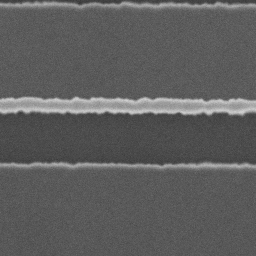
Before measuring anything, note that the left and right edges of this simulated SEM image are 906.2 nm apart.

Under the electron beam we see lines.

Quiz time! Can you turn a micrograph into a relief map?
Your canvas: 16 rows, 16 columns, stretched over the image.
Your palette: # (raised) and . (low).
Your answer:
################
################
################
################
################
################
################
................
................
................
################
################
################
################
################
################